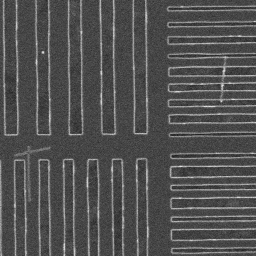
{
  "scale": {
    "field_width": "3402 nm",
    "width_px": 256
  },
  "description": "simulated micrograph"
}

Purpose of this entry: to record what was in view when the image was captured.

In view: groups of lines, slits or small figures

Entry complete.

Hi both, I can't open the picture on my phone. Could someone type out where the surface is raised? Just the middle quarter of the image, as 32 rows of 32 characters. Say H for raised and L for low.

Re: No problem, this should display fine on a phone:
HLLLLHHHHLLLHHHHHLLLLHHHHHHHHHHH
HLLLLHHHHLLLHHHHHLLLLHHHHHLLLLLL
HLLLLHHHHLLLLHHHHLLLLHHHHHLLLLLL
HLLLLHHHHLLLLHHHHLLLLHHHHHHHHHHH
HLLLLHHHHLLLLHHHHLLLLHHHHHHHHHHH
HLLLLHHHHLLLLHHHHHLLLHHHHHLLLLLL
HLLLLHHHHLLLLHHHHHLLLHHHHHLLLLLL
HLLLLHHHHLLLLHHHHHLLLHHHHHHHHHHH
HLLLLHHHHLLLLHHHHHLLLHHHHHHHHHHH
HLLLLHHHHLLLLHHHHHLLLHHHHHLLLLLL
HLLLLHHHHLLLLHHHHHLLLHHHHHLLLLLL
HLLLLHHHHLLLLHHHHHLLLHHHHHHHHHHH
HLLLLHHHHLLLLHHHHHLLLHHHHHHHHHHH
HLLLLHHHHLLLLHHHHHLLLHHHHHLLLLLL
HLLLLHHHHLLLLHHHHHLLLHHHHHHLLLLL
HLLLLHHHHHLLLHHHHHLLLHHHHHHHHHHH
HLLLLHHHHHLLLHHHHHLLLHHHHHHHHHHH
HLLLHHHHHHLLHHHHHHLLHHHHHHHLLLLL
HHHHHHHHHHHHHHHHHHHHHHHHHHHHHHHH
HHHHHHHHHHHHHHHHHHHHHHHHHHHHHHHH
HHHHHHHHHHHHHHHHHHHHHHHHHHHHHHHH
HHHHHHHHHHHHHHHHHHHHHHHHHHHHHHHH
HHHHHHHHHHHHHHHHHHHHHHHHHHHHHHLL
HHHHHHHHHHHHHHHHHHHHHHHHHHHLLLLL
LLHHHHLLHHHHLLLHHHLLLHHHHHHHHHHH
LLHHHHLLHHHHLLLHHHLLLHHHHHHHHHHH
LLHHHHLLLHHHLLLHHHLLLHHHHHHLLLLL
LLHHHHLLLHHHLLLHHHLLLHHHHHHLLLLL
LLHHHHLLLHHHLLLHHHLLLHHHHHHHHHHH
LLHHHHLLLHHHLLLHHHLLLHHHHHHHHHHH
LLHHHHLLLHHHLLLHHHLLLHHHHHHLLLLL
LLHHHHLLLHHHLLLHHHLLLHHHHHHLLLLH